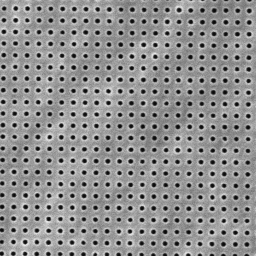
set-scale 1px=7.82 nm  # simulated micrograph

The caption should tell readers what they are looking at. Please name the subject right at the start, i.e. a regular array of holes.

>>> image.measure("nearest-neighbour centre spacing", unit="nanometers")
89.6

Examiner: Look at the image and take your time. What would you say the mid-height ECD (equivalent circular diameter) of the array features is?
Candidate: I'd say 37.5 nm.